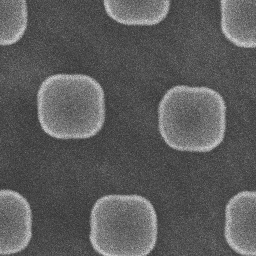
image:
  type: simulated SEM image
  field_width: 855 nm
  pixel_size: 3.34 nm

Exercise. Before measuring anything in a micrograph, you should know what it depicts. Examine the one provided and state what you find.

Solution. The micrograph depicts raised bodies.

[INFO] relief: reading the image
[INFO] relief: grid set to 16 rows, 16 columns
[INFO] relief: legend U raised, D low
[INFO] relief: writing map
UUDDDDDUUUDDDDUU
UUDDDDDDDDDDDDUU
UDDDDDDDDDDDDDDU
DDDDDDDDDDDDDDDD
DDDDDDDDDDDDDDDD
DDDUUUDDDDDDDDDD
DDUUUUDDDDUUUUDD
DDDUUUDDDDUUUUDD
DDDUUDDDDDUUUUDD
DDDDDDDDDDDDDDDD
DDDDDDDDDDDDDDDD
DDDDDDDDDDDDDDDD
UDDDDDUUUDDDDDDU
UUDDDDUUUUDDDDUU
UUDDDDUUUUDDDDUU
UDDDDDUUUDDDDDDU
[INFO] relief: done